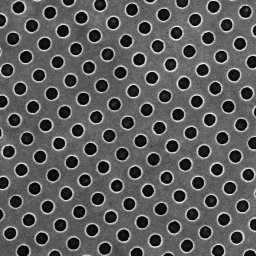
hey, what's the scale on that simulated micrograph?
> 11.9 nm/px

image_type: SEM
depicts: a regular array of holes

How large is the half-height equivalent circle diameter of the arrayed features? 153 nanometres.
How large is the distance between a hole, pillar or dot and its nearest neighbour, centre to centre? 266 nm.